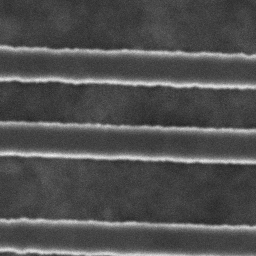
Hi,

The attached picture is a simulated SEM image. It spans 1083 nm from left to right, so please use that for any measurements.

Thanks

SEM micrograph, lines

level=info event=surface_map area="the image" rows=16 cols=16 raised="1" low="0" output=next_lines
0000000000000000
0000000000000000
0000000000000000
1111111111111111
1111111111111111
0000000000000000
0000000000000000
0000000000000000
1111111111111111
1111111111111111
0000000000000000
0000000000000000
0000000000000000
0000000000000000
1111111111111111
1111111111111111